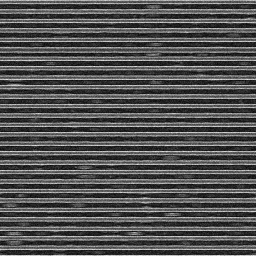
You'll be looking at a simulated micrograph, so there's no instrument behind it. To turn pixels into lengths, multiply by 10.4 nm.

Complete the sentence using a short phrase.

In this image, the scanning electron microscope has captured parallel lines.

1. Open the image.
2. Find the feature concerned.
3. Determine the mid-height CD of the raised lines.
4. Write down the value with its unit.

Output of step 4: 3.87 px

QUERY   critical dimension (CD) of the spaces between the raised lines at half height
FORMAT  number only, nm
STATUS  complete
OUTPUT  59.7